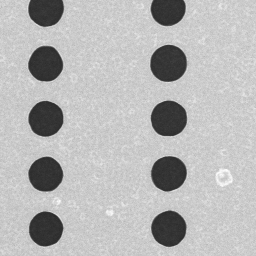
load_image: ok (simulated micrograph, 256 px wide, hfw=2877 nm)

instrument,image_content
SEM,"a regular array of holes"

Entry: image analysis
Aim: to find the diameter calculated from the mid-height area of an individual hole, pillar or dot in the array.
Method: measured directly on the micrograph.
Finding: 397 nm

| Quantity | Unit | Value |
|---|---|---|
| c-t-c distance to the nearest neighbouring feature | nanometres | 619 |